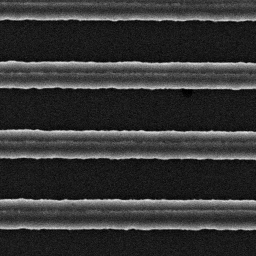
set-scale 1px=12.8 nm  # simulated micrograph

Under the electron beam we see lines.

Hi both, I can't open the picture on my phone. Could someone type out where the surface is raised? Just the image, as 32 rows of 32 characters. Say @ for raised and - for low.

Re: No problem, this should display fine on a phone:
@@@@@@@@@@@@@@@@@@@@@@@@@@@@@@@@
@@@@@@@@@@@@@@@@@@@@@@@@@@@@@@@@
--------------@-------@---@@@@@-
--------------------------------
--------------------------------
--------------------------------
--------------------------------
--------------------------------
@@@@@@@@@@@@@@@@@@@@@@@@@@@@@@@@
@@@@@@@@@@@@@@@@@@@@@@@@@@@@@@@@
@@@@@@@@@@@@@@@@@@@@@@@@@@@@@@@@
--------------------------------
--------------------------------
--------------------------------
--------------------------------
--------------------------------
@@@@@@@@@@@@@@@@@@@@@@@@@@@@@@@@
@@@@@@@@@@@@@@@@@@@@@@@@@@@@@@@@
@@@@@@@@@@@@@@@@@@@@@@@@@@@@@@@@
@@@@@@@@@@@@@@@@@@@@@@@@@@@@@@@@
--------------------------------
--------------------------------
--------------------------------
--------------------------------
--------------------------------
@@@@@@@@@@@@@@@@@@@@@@@@@@@@@@@@
@@@@@@@@@@@@@@@@@@@@@@@@@@@@@@@@
@@@@@@@@@@@@@@@@@@@@@@@@@@@@@@@@
@@@@@@@@@@@@@-@@@@@@@@@@@@@@@@@@
--------------------------------
--------------------------------
--------------------------------